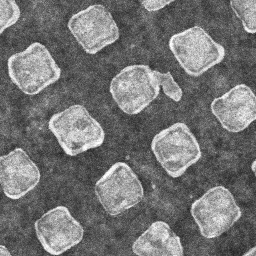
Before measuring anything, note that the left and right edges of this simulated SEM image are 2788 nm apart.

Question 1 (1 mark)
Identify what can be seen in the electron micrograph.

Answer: a regular array of raised bodies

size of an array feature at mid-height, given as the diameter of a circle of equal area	489	nm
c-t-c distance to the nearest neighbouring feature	784	nm